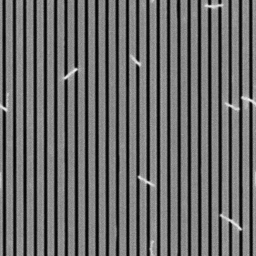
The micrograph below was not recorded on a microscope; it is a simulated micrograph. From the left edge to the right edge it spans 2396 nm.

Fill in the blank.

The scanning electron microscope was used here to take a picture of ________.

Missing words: parallel lines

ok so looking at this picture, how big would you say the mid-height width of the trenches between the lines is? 0.0269 micrometres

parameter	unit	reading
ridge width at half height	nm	62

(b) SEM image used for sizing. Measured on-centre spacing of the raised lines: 96.1 nanometers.